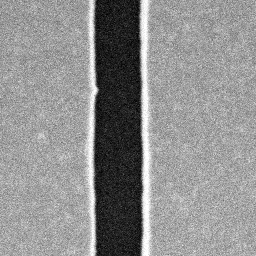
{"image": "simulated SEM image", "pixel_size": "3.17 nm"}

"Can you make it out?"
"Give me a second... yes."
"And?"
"one or a few lines or trenches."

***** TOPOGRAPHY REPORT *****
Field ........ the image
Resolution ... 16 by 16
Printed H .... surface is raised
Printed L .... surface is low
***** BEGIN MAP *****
HHHHHHLLLHHHHHHH
HHHHHHLLLHHHHHHH
HHHHHHLLLHHHHHHH
HHHHHHLLLHHHHHHH
HHHHHHLLLHHHHHHH
HHHHHHLLLHHHHHHH
HHHHHHLLLHHHHHHH
HHHHHHLLLHHHHHHH
HHHHHHLLLHHHHHHH
HHHHHHLLLHHHHHHH
HHHHHHLLLHHHHHHH
HHHHHHLLLHHHHHHH
HHHHHHLLLHHHHHHH
HHHHHHLLLHHHHHHH
HHHHHHLLLHHHHHHH
HHHHHHLLLHHHHHHH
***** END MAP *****